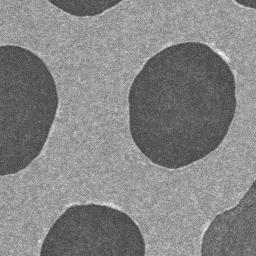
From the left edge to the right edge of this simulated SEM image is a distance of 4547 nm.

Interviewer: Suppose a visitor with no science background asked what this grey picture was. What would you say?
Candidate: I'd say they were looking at holes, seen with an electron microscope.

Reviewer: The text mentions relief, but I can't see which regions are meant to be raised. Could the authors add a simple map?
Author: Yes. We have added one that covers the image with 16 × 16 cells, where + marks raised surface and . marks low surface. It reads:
++++...+++++++++
++++++++++++++++
++++++++++++++++
..++++++++....++
...++++++......+
....++++.......+
....++++.......+
...+++++.......+
...+++++......++
...++++++....+++
..++++++++.+++++
++++++++++++++++
+++++++++++++++.
++++....++++++..
+++......++++...
+++......++++...